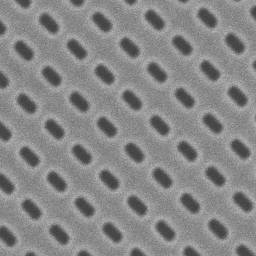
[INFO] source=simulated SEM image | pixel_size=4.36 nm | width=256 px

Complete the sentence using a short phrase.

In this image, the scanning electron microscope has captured a regular array of holes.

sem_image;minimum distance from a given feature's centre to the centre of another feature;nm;161